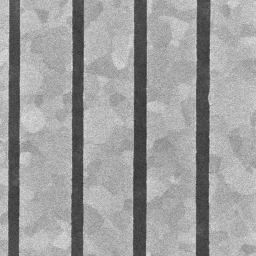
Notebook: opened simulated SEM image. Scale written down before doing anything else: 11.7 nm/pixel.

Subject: one or a few lines or trenches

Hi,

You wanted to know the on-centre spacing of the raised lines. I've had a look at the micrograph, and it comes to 737 nm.